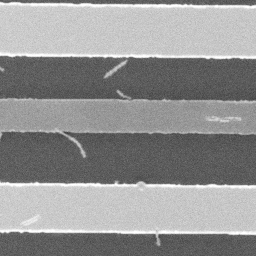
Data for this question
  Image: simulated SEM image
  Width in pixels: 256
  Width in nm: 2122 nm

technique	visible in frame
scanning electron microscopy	lines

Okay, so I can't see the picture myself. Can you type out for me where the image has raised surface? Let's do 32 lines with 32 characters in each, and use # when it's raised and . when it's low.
###.............................
################################
################################
################################
################################
################################
################################
................................
................................
................................
................................
................................
####............................
################################
################################
################################
..#..###.#######################
................................
................................
................................
................................
................................
................................
################################
################################
################################
################################
################################
################################
................................
................................
................................